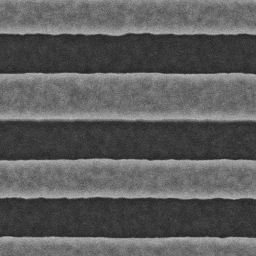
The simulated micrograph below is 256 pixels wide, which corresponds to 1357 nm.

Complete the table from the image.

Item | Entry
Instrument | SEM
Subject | lines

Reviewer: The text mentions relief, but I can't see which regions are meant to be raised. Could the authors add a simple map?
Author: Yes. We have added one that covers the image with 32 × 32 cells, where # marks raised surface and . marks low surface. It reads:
################################
################################
################################
################################
................................
................................
................................
................................
................................
################################
################################
################################
################################
################################
################################
................................
................................
................................
................................
................................
################################
################################
################################
################################
################################
................................
................................
................................
................................
................................
################################
################################